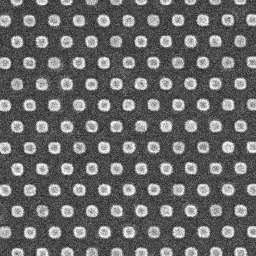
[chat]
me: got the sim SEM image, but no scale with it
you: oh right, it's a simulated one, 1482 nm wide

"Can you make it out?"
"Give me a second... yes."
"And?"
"a regular array of raised bodies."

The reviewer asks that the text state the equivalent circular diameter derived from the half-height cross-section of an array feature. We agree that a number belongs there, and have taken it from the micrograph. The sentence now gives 68.2 nanometres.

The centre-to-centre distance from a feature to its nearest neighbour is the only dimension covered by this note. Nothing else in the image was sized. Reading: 140 nm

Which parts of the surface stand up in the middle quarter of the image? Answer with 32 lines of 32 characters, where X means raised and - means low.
--XXX----XX----XX----XXX---XXX--
--------------------------------
--------------------------------
--------------------------------
XX----XX----XX----XX----XXX---XX
XX----XX----XX----XX----XXX---XX
--------------------------------
--------------------------------
--------------------------------
--XXX----XX----XX----XXX---XXX--
--XXX----XX----XXX---XXX---XXX--
----------X-----------------XX--
--------------------------------
--------------------------------
XX----XX----XX----XX-----X-----X
XX----XX----XX----XX----XXX---XX
XX----XX----XX----XX----XXX----X
--------------------------------
--------------------------------
--------------------------------
---XX----XX----XXX---XXX---XXX--
---XX----XX----XXX---XXX---XXX--
--------------------------------
--------------------------------
--------------------------------
XX----XX----XX----XXX---XXX---XX
XX----XX----XX----XXX---XXX---XX
-------------------------X------
--------------------------------
--------------------------------
---XX----XX----XX-----X-----XX--
---XX----XX----XXX---XXX---XXX--